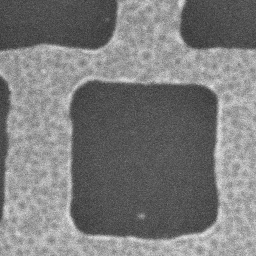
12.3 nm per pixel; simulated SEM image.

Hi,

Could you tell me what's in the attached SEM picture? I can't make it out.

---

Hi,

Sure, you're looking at holes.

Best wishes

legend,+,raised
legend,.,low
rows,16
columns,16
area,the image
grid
.......++++.....
.......++++.....
.......++++.....
++++++++++++++++
++++++++++++++++
.++++........+++
.+++..........++
++++..........++
++++..........++
++++.........+++
++++.........+++
++++..........++
++++..........++
++++..........++
+++++........+++
++++++++++++++++